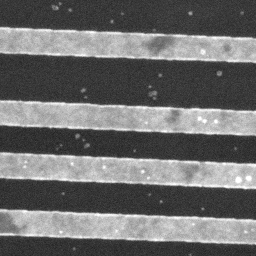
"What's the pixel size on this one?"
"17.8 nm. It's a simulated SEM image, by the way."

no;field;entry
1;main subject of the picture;lines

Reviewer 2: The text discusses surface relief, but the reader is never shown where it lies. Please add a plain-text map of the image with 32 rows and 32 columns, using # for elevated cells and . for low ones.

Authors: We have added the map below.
................................
................................
................................
................................
########################........
################################
################################
.........................#######
................................
................................
................................
................................
................................
#####################...........
################################
################################
.......................#########
................................
................................
#######.........................
##############################..
################################
.......#########################
..............................##
................................
................................
########........................
##############################..
################################
......##########################
...............................#
................................